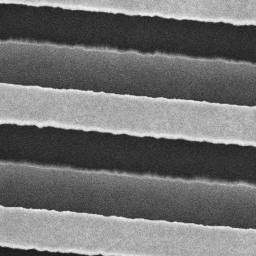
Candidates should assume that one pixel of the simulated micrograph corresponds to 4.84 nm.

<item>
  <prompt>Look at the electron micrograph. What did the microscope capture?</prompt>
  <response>lines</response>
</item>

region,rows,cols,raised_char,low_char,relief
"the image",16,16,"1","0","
0000111111111111
0000000000000001
0000000000000000
1111111111000000
1111111111111111
1111111111111111
1111111111111111
1111111111111111
0000000001111111
0000000000000000
1110000000000000
1111111111111100
1111111111111111
1111111111111111
1111111111111111
0111111111111111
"